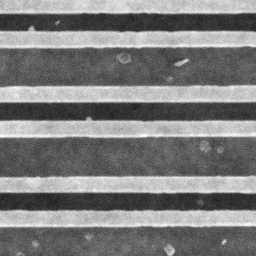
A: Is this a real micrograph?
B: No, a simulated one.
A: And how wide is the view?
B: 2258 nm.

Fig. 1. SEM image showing lines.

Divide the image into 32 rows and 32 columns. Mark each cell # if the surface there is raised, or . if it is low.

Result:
################################
################################
................................
................................
################################
################################
................................
................................
................................
................................
................................
################################
################################
................................
................................
################################
################################
................................
................................
................................
................................
................................
################################
################################
................................
................................
################################
################################
................................
................................
................................
................................